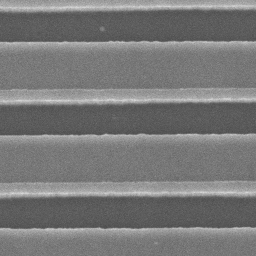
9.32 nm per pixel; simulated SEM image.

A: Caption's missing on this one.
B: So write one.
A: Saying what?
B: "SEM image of lines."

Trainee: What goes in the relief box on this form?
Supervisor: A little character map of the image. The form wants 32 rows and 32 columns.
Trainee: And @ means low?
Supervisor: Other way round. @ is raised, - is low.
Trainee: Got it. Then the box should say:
@@@@@@@@@@@@@@@@@@@@@@@@@@@@@@@@
--------------------------------
--------------------------------
--------------------------------
--------------------------------
@@@@@@@@@@@@@@@@@@@@@@@@@@@@@@@@
@@@@@@@@@@@@@@@@@@@@@@@@@@@@@@@@
@@@@@@@@@@@@@@@@@@@@@@@@@@@@@@@@
@@@@@@@@@@@@@@@@@@@@@@@@@@@@@@@@
@@@@@@@@@@@@@@@@@@@@@@@@@@@@@@@@
@@@@@@@@@@@@@@@@@@@@@@@@@@@@@@@@
@@@@@@@@@@@@@@@@@@@@@@@@@@@@@@@@
@@@@@@@@@@@@@@@@@@@@@@@@@@@-----
--------------------------------
--------------------------------
--------------------------------
--------------------------------
@@@@@@@@@@@@@@@@@@@@@@@@@@@@@@@@
@@@@@@@@@@@@@@@@@@@@@@@@@@@@@@@@
@@@@@@@@@@@@@@@@@@@@@@@@@@@@@@@@
@@@@@@@@@@@@@@@@@@@@@@@@@@@@@@@@
@@@@@@@@@@@@@@@@@@@@@@@@@@@@@@@@
@@@@@@@@@@@@@@@@@@@@@@@@@@@@@@@@
@@@@@@@@@@@@@@@@@@@@@@@@@@@@@@@@
--------------------------------
--------------------------------
--------------------------------
--------------------------------
----------------------@-@----@@@
@@@@@@@@@@@@@@@@@@@@@@@@@@@@@@@@
@@@@@@@@@@@@@@@@@@@@@@@@@@@@@@@@
@@@@@@@@@@@@@@@@@@@@@@@@@@@@@@@@